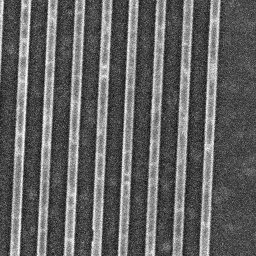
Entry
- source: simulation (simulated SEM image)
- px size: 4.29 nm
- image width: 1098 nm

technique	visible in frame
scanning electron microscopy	parallel lines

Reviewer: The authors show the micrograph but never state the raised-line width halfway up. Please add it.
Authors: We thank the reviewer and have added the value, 0.0375 microns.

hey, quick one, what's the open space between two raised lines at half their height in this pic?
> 79.9 nm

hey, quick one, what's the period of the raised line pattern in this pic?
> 0.116 um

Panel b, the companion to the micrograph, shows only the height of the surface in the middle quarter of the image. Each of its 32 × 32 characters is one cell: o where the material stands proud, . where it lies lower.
..oo.....oo.....oo.....oo....oo.
..oo.....oo.....oo.....oo....oo.
..oo.....oo.....oo.....o.....oo.
..oo.....oo.....oo....oo.....oo.
..oo.....oo.....oo....oo.....oo.
..oo.....oo.....oo....oo.....oo.
..oo.....oo....oo.....oo.....oo.
..oo.....oo....oo.....oo.....oo.
..oo.....oo....oo.....oo.....oo.
..oo.....oo....oo.....oo.....oo.
..oo.....oo....oo.....oo.....oo.
..oo.....oo....oo.....oo.....oo.
..oo.....oo....oo.....oo.....oo.
..oo.....oo....oo.....oo.....oo.
..oo.....oo....oo.....oo.....oo.
..oo....oo.....oo.....oo.....oo.
..oo....oo.....oo.....oo.....oo.
..oo....oo.....oo.....oo.....oo.
.oo.....oo.....oo.....oo.....oo.
.oo.....oo.....oo.....oo.....oo.
.oo.....oo.....oo.....oo.....oo.
.oo.....oo.....oo.....oo.....o..
.oo.....oo.....oo.....oo....oo..
.oo.....oo.....oo.....oo....oo..
.oo.....oo.....oo.....oo....oo..
.oo.....oo.....oo....oo.....oo..
.oo.....oo.....oo....oo.....oo..
.oo.....oo.....oo....oo.....oo..
.oo.....oo....oo.....oo.....oo..
.oo.....oo....oo.....oo.....oo..
.oo.....oo....oo.....oo.....oo..
.oo.....oo....oo.....oo.....oo..